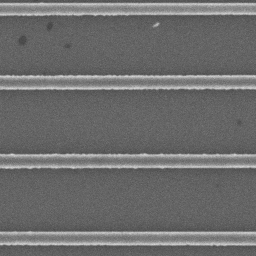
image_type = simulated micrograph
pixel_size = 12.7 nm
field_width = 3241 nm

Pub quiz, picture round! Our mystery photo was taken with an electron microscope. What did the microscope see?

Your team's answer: lines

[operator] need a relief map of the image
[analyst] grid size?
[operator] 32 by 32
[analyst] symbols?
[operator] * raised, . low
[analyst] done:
********************************
********************************
................................
................................
................................
................................
................................
................................
................................
*****.**************************
********************************
................................
................................
................................
................................
................................
................................
................................
................................
********************************
********************************
................................
................................
................................
................................
................................
................................
................................
................................
********************************
********************************
................................